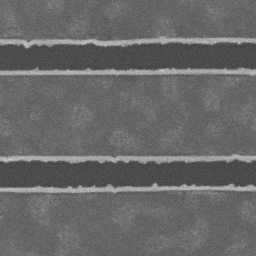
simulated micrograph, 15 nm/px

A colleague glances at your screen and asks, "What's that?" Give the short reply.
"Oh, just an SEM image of one or a few lines or trenches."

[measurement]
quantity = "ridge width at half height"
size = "474 nanometers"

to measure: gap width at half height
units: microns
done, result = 1.27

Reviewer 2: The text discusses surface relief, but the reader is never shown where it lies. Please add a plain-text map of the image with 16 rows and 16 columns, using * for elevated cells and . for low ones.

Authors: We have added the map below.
................
................
...........****.
****************
***********...**
................
................
................
................
................
****************
****************
................
................
................
................